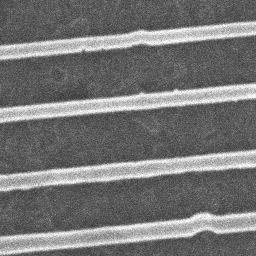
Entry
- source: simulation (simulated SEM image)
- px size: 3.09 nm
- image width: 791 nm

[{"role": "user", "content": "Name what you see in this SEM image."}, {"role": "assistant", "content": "one or a few lines or trenches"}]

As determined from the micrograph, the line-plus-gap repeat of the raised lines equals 198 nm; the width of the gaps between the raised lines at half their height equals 156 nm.